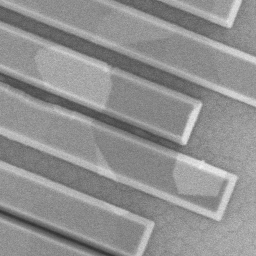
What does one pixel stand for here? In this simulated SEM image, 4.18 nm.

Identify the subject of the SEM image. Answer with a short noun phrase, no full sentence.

one or a few lines or trenches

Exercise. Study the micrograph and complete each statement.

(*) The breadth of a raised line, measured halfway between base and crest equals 171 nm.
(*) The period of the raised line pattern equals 62.4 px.